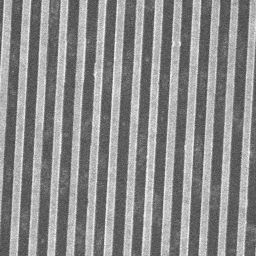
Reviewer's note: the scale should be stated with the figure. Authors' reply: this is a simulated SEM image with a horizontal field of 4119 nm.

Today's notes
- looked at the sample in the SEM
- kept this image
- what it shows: parallel lines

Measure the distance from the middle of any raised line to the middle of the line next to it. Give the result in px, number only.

18.9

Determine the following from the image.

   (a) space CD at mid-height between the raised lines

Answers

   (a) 0.193 micrometres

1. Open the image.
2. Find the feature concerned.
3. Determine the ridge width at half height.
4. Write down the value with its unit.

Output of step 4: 112 nanometres